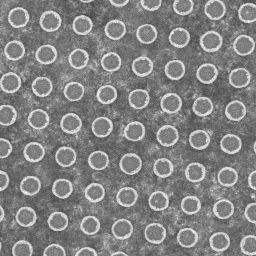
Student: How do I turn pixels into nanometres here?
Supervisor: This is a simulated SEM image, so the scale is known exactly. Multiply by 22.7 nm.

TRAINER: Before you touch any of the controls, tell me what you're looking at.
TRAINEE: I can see a regular array of raised bodies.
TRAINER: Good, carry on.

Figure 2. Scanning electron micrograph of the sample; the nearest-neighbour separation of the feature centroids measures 0.732 µm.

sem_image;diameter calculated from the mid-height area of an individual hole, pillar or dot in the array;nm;431